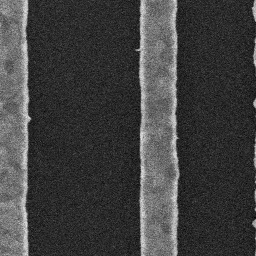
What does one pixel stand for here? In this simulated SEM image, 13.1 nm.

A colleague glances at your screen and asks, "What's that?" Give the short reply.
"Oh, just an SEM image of one or a few lines or trenches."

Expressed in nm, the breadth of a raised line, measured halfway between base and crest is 426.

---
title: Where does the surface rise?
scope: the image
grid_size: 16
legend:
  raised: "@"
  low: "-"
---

@@-------@@-----
@@-------@@-----
@@-------@@-----
@@-------@@-----
@@-------@@-----
@@-------@@-----
@@-------@@-----
@@-------@@-----
@@-------@@-----
@@-------@@-----
@@-------@@-----
@@-------@@-----
@--------@@-----
@@-------@@-----
@@-------@@-----
@@-------@@-----